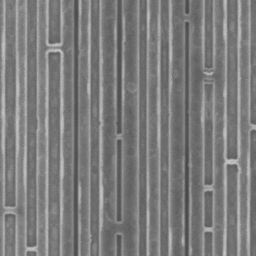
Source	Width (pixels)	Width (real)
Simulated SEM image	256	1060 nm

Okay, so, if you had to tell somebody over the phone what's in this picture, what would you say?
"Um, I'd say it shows parallel lines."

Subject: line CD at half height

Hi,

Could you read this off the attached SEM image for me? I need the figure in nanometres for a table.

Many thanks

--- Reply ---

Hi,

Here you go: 54.3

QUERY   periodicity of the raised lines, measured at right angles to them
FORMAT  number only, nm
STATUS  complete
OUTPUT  92.2